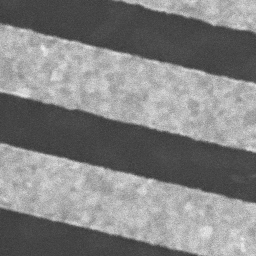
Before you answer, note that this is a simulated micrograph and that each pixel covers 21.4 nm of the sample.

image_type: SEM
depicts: one or a few lines or trenches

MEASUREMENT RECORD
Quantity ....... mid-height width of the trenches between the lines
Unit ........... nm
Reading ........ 1080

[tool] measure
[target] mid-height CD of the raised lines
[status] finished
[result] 1370 nanometers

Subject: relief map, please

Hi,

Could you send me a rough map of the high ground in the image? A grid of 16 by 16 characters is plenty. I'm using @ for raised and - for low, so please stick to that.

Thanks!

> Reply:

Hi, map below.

---------@@@@@@@
-------------@@@
@@@@------------
@@@@@@@@--------
@@@@@@@@@@@@@---
@@@@@@@@@@@@@@@@
---@@@@@@@@@@@@@
-------@@@@@@@@@
------------@@@@
@@--------------
@@@@@@----------
@@@@@@@@@@@-----
@@@@@@@@@@@@@@@-
--@@@@@@@@@@@@@@
-------@@@@@@@@@
-----------@@@@@